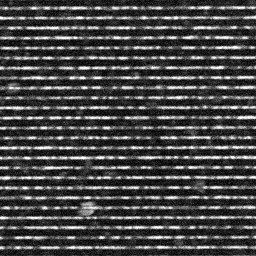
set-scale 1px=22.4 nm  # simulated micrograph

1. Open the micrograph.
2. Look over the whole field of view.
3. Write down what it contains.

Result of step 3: parallel lines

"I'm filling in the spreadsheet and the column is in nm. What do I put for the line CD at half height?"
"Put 44.7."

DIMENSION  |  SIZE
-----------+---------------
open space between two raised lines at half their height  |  179 nanometres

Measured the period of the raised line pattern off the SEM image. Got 223 nm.